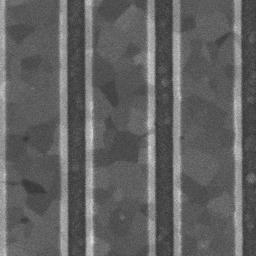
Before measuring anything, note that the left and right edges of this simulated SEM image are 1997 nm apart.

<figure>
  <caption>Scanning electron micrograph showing one or a few lines or trenches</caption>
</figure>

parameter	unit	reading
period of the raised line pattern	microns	0.681